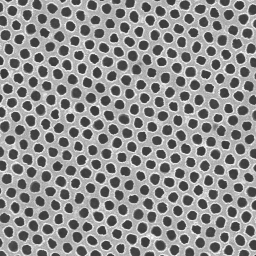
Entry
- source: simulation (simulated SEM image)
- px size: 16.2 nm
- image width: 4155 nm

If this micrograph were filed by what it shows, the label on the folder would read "a regular array of holes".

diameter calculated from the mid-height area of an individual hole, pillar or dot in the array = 0.158 um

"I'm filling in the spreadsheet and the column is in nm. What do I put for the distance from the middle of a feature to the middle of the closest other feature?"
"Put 227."